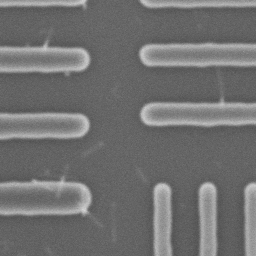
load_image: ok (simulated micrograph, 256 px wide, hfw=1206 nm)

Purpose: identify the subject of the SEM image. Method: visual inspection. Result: groups of lines, slits or small figures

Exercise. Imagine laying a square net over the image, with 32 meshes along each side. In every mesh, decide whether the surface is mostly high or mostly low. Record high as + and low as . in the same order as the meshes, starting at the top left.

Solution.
++++++++++........++++++++++++++
................................
................................
................................
................................
................................
+++++++++++.......++++++++++++++
+++++++++++.......++++++++++++++
++++++++++......................
................................
................................
................................
................................
..................++++++++++++++
++++++++++........++++++++++++++
+++++++++++........++...+++.....
+++++++++++.....................
................................
................................
................................
................................
................................
................................
+++++++++++........++....++....+
+++++++++++........++....++....+
+++++++++++........++....++....+
+++++++++++........++....++....+
...................++....++....+
...................++....++....+
...................++....++....+
...................++....++....+
...................++....++....+